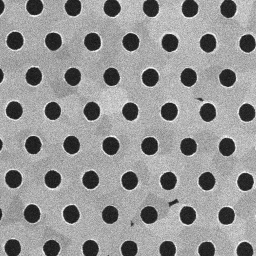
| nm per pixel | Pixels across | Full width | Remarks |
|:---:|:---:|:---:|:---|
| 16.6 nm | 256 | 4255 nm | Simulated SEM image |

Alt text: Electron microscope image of a regular array of holes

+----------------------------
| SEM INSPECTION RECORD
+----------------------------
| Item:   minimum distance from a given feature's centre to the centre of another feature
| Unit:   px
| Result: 38.3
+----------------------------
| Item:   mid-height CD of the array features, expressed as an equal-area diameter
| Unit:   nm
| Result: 299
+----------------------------